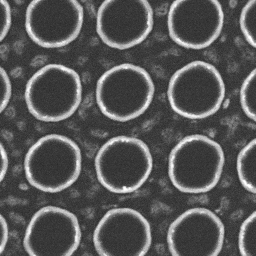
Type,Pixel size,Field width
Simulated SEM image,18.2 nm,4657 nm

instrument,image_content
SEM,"raised bodies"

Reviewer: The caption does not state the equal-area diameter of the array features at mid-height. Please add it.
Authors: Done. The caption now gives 0.973 microns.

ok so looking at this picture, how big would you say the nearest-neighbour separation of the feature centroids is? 1290 nm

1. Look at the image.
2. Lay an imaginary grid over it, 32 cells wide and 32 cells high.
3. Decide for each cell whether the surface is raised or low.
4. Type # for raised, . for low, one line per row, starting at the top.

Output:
#...#####....#####....#####....#
#...######...######..#######..##
#...######..#######..#######..##
#...######..#######..######...##
....#####....#####....#####....#
.....###......##.......###......
................................
................................
......##.......##......###......
#...#####....#####....#####....#
#...######...######...######...#
#..#######..#######..#######..##
#..#######..#######..#######..##
....#####....#####....#####....#
.....###......##.......##.......
................................
................................
.....###......##.......###......
....#####....#####....#####....#
#...######..#######...######..##
#..#######..#######..#######..##
...#######..#######..######...##
....#####....#####....#####...##
.....###......###......###.....#
................................
................................
.....###......###.......##......
....#####....#####....#####....#
#...######..######....######..##
#..#######..#######..#######..##
...#######..######...######...##
....#####....#####....#####...##